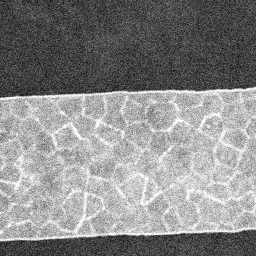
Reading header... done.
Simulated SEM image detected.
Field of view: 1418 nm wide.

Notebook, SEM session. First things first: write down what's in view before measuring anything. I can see one or a few lines or trenches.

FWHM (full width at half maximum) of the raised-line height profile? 785 nm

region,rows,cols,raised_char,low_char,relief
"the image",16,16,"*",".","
................
................
................
................
................
................
****************
****************
****************
****************
****************
****************
****************
****************
***********.....
................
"